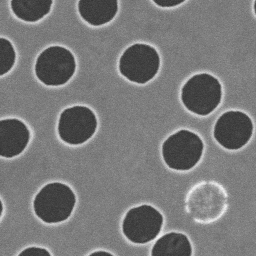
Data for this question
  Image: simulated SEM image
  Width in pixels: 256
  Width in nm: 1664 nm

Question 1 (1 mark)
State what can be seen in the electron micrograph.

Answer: a regular array of holes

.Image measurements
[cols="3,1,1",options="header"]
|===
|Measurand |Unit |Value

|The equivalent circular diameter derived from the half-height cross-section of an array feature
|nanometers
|259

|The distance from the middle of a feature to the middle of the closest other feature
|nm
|408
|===